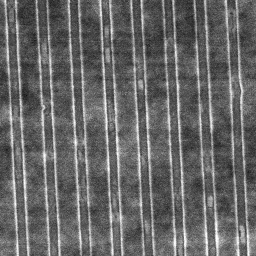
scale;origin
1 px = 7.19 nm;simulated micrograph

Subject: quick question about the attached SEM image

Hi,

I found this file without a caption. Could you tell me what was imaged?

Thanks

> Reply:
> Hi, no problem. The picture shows parallel lines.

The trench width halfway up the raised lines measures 66.4 nm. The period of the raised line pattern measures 227 nanometres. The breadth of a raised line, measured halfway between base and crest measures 162 nm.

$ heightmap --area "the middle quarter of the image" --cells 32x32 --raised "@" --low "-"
@@--@@@@@@--@@@@@@--@@@@@@--@@@@
@@--@@@@@@--@@@@@@--@@@@@@--@@@@
@@---@@@@@--@@@@@@--@@@@@@--@@@@
@@---@@@@@---@@@@@--@@@@@@--@@@@
@@---@@@@@---@@@@@--@@@@@@--@@@@
@@---@@@@@---@@@@@-@@@@@@@--@@@@
@@---@@@@@---@@@@@--@@@@@@--@@@@
@@---@@@@@---@@@@@--@@@@@@--@@@@
@@---@@@@@---@@@@@---@@@@@---@@@
@@---@@@@@---@@@@@---@@@@@---@@@
@@---@@@@@---@@@@@---@@@@@---@@@
@@---@@@@@---@@@@@---@@@@@---@@@
@@@--@@@@@---@@@@@---@@@@@---@@@
@@@--@@@@@@--@@@@@---@@@@@---@@@
@@@--@@@@@@--@@@@@---@@@@@---@@@
@@@--@@@@@@--@@@@@---@@@@@---@@@
@@@--@@@@@@--@@@@@---@@@@@---@@@
@@@--@@@@@@--@@@@@---@@@@@---@@@
@@@--@@@@@@--@@@@@@--@@@@@---@@@
@@@--@@@@@@--@@@@@@--@@@@@@--@@@
@@@--@@@@@@--@@@@@@--@@@@@@--@@@
@@@--@@@@@@--@@@@@@--@@@@@@--@@@
@@@--@@@@@@--@@@@@@--@@@@@@--@@@
@@@--@@@@@@---@@@@@--@@@@@@--@@@
@@@---@@@@@---@@@@@--@@@@@@--@@@
@@@---@@@@@---@@@@@--@@@@@@--@@@
@@@---@@@@@---@@@@@--@@@@@@--@@@
@@@---@@@@@---@@@@@--@@@@@@--@@@
@@@---@@@@@---@@@@@---@@@@@--@@@
@@@---@@@@@---@@@@@---@@@@@---@@
@@@---@@@@@---@@@@@---@@@@@---@@
@@@---@@@@@---@@@@@---@@@@@---@@